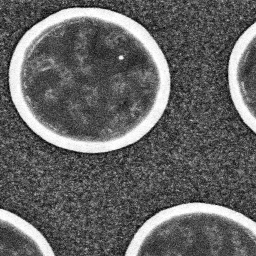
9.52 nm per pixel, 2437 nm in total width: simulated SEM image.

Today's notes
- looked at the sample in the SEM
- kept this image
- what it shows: raised bodies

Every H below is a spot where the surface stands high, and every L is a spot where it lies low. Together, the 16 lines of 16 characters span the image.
LLLLLLLLLLLLLLLL
LLLHHHHHLLLLLLLL
LLHHHHHHHLLLLLLH
LHHHHHHHHHLLLLLH
LHHHHHHHHHLLLLHH
LHHHHHHHHHLLLLLH
LHHHHHHHHHLLLLLH
LLHHHHHHHLLLLLLL
LLLHHHHHLLLLLLLL
LLLLLLLLLLLLLLLL
LLLLLLLLLLLLLLLL
LLLLLLLLLLLLLLLL
LLLLLLLLLLLLLLLL
LLLLLLLLLLHHHHHL
HHLLLLLLLHHHHHHH
HHHLLLLLHHHHHHHH